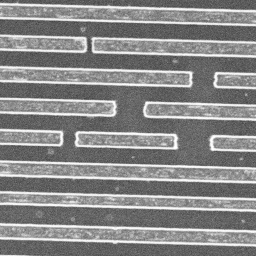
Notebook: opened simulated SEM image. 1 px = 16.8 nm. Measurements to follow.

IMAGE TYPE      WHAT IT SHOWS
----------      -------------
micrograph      parallel lines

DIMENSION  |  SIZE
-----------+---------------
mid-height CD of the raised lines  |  0.234 µm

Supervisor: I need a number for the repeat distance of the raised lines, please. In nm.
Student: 527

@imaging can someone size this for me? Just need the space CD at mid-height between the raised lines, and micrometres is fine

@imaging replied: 0.297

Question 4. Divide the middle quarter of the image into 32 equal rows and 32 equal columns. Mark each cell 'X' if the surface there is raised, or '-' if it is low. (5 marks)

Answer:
--------------------------------
XXXXXXXXX-----------------------
XXXXXXXXXXXXXXXXXXXXXXXXXXXXXXXX
XXXXXXXXXXXXXXXXXXXXXXXXXXXXXXXX
XXXXXXXXXXXXXXXXXXXXXXXXXXXXXXXX
--------------------------------
--------------------------------
--------------------------------
--------------------------------
XXXXXXXXXX----------------------
XXXXXXXXXXXXX-------XXXXXXXXXXXX
XXXXXXXXXXXXX-------XXXXXXXXXXXX
XXXXXXXXXXXX--------XXXXXXXXXXXX
--------------------------------
--------------------------------
--------------------------------
--------------------------------
---XXXXXXXX-X-XXXXX-------------
---XXXXXXXXXXXXXXXXXXXXXXXXX----
---XXXXXXXXXXXXXXXXXXXXXXXXX----
---------XXXXXXXXXXXXXXXXXXX----
--------------------------------
--------------------------------
--------------------------------
--------------------------------
XXXXXXXXXXXXXXXXXXXX------------
XXXXXXXXXXXXXXXXXXXXXXXXXXXXXXXX
XXXXXXXXXXXXXXXXXXXXXXXXXXXXXXXX
----------XXXXXXXXXXXXXXXXXXXXXX
--------------------------------
--------------------------------
--------------------------------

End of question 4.